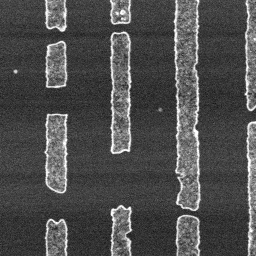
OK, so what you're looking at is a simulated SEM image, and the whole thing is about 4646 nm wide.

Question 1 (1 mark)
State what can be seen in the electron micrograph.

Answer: one or a few lines or trenches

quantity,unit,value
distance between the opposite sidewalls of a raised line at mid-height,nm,320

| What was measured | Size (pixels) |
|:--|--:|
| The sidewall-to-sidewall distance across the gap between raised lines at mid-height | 48.1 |